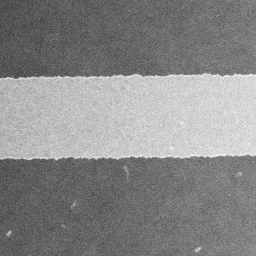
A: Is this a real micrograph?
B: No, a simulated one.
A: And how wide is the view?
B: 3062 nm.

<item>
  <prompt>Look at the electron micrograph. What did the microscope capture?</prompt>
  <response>one or a few lines or trenches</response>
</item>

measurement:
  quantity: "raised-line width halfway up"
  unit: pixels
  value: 80.7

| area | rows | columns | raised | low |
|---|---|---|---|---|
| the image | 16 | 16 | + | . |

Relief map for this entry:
................
................
................
................
................
++++++++++++++++
++++++++++++++++
++++++++++++++++
++++++++++++++++
++++++++++++++++
................
................
................
................
................
................